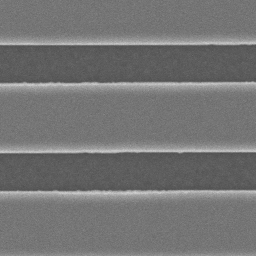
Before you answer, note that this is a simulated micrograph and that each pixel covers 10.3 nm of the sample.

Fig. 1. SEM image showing lines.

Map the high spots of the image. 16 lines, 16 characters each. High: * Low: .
****************
****************
****************
................
................
****************
****************
****************
****************
********........
................
................
****************
****************
****************
****************